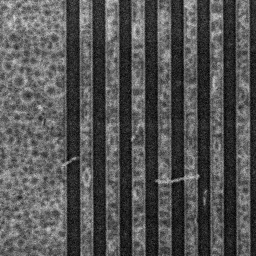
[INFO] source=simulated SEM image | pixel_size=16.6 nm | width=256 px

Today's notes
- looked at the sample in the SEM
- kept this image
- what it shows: parallel lines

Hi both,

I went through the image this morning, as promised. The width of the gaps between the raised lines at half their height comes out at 0.224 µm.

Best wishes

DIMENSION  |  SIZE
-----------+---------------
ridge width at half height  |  208 nanometers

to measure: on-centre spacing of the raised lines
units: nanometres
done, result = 433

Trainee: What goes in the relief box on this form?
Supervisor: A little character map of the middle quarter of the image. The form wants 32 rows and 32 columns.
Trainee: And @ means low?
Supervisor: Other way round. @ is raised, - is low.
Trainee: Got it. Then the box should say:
----@@@----@@----@@@----@@----@@
----@@@----@@----@@@----@@----@@
----@@@----@@----@@@----@@----@@
----@@@----@@----@@@----@@----@@
----@@@----@@----@@@----@@----@@
----@@@----@@@---@@@----@@----@@
----@@@----@@@---@@@----@@----@@
----@@@----@@@---@@@----@@@---@@
----@@@----@@@---@@@----@@@---@@
----@@@----@@@---@@@----@@@---@@
----@@@----@@@---@@@----@@@---@@
----@@@----@@@---@@@----@@@---@@
@---@@@----@@@---@@@----@@@---@@
@---@@@----@@@---@@@----@@@---@@
@---@@@----@@@---@@@----@@@---@@
@---@@@----@@@---@@@----@@@---@@
----@@@----@@@---@@@----@@@---@@
----@@@----@@@---@@@----@@@---@@
----@@@----@@@---@@@----@@@---@@
----@@@----@@@---@@@----@@@---@@
----@@@----@@@---@@@----@@@---@@
----@@@----@@@---@@@----@@@---@@
----@@@----@@@---@@@----@@@---@@
----@@@----@@@---@@@----@@@---@@
@---@@@----@@@---@@@----@@@---@@
@---@@@----@@@---@@@----@@@---@@
----@@@----@@@---@@@----@@@---@@
----@@@----@@@---@@@----@@@---@@
----@@@----@@@---@@@----@@@---@@
----@@@----@@@---@@@---@@@@---@@
----@@@----@@@---@@@----@@@---@@
----@@@----@@@---@@@----@@@---@@